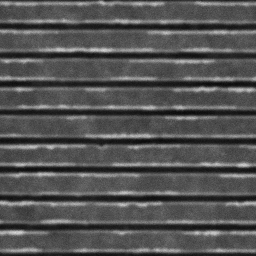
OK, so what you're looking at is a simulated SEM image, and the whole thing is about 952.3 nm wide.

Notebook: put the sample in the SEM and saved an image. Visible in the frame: parallel lines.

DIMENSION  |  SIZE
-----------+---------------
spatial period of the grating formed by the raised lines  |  0.107 µm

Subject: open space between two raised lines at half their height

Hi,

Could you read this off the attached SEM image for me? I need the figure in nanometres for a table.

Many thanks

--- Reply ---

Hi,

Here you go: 29.3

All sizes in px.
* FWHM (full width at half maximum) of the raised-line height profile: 20.8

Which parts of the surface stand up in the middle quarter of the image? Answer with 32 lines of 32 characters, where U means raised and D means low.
UUUUUUUUUUUUUUUUUUUUUUUUUUUUUUUU
UUUUUUUUUUUUUUUUUUUUUUUUUUUUUUUU
UUUUUUUUUUUUUUUUUUUUUUUUUUUUUUUU
UUUUUUUUUUUUUUUUUUUUUUUUUUUUUUUU
DDDDDDDDDDDDDDDDDDDDDDDDDDDDDDDD
DDDDDDDDDDDDDDDDDDDDDDDDDDDDDDDD
UUUUUUUUUUUUUUUUUUUUUUUUUUUUUUUU
UUUUUUUUUUUUUUUUUUUUUUUUUUUUUUUU
UUUUUUUUUUUUUUUUUUUUUUUUUUUUUUUU
UUUUUUUUUUUUUUUUUUUUUUUUUUUUUUUU
UUUUUUUUUUUUUUUUUUUUUUUUUUUUUUUU
DDDDDDDDDDDDDDDDDDDDDDDDDDDDDDDD
DDDDDDDDDDDDDDDDDDDDDDDDDDDDDDDD
UUUUUUUUUUUUUUUUUUUUUUUUUUUUUUUU
UUUUUUUUUUUUUUUUUUUUUUUUUUUUUUUU
UUUUUUUUUUUUUUUUUUUUUUUUUUUUUUUU
UUUUUUUUUUUUUUUUUUUUUUUUUUUUUUUU
UUUUUUUUUUUUUUUUUUUUUUUUUUUUUUUU
DDDDDDDDDDDDDDDDDDDDDDDDDDDDDDDD
DDDDDDDDDDDDDDDDDDDDDDDDDDDDDDDD
UUUUUUUUUDUUUUUUUUUUUUUUUUUUUUUU
UUUUUUUUUUUUUUUUUUUUUUUUUUUUUUUU
UUUUUUUUUUUUUUUUUUUUUUUUUUUUUUUU
UUUUUUUUUUUUUUUUUUUUUUUUUUUUUUUU
UUUUUUUUUUUUUUUUUUUUUUUUUUUUUUUU
DDDDDDDDDDDDDDDDDDDDDDDDDDDDDDDD
DDDDDDDDDDDDDDDDDDDDDDDDDDDDDDDD
DDDDDDDDDDDDDDDDDDDDDDDDDDDDDDDD
UUUUUUUUUUUUUUUUUUUUUUUUUUUUUUUU
UUUUUUUUUUUUUUUUUUUUUUUUUUUUUUUU
UUUUUUUUUUUUUUUUUUUUUUUUUUUUUUUU
UUUUUUUUUUUUUUUUUUUUUUUUUUUUUUUU